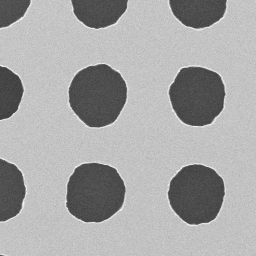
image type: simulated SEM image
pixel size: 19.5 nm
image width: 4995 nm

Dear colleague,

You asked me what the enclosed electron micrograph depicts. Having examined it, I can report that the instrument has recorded holes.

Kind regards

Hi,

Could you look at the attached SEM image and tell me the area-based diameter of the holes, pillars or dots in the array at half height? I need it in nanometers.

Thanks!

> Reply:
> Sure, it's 1160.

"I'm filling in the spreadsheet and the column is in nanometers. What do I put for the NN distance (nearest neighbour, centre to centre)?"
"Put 1910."